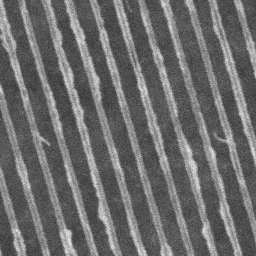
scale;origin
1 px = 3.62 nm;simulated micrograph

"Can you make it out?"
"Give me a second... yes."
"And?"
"parallel lines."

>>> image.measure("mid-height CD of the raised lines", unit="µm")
0.0209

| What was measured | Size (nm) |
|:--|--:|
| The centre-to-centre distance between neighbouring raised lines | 83.3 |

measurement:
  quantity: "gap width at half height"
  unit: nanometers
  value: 59.1